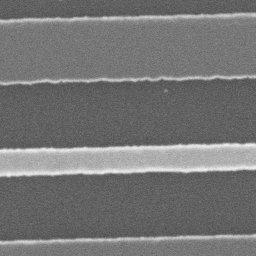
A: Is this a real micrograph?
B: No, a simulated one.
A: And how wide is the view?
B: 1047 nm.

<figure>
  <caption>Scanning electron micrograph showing lines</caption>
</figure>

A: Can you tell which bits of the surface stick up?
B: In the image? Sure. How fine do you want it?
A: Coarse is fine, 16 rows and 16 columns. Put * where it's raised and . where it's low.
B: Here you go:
................
****************
****************
****************
****************
................
................
................
................
****************
****************
................
................
................
................
****************